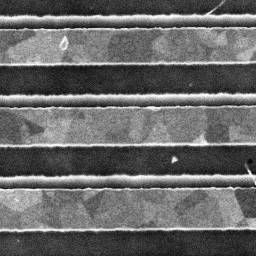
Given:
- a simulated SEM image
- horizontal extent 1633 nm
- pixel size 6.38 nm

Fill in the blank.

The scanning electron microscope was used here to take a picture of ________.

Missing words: lines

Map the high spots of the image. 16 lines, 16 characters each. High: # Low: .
................
################
################
################
................
................
################
################
################
................
................
################
################
################
................
................